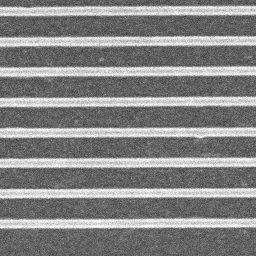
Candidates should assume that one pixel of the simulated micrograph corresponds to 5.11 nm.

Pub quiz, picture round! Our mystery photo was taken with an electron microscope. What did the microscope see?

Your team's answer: parallel lines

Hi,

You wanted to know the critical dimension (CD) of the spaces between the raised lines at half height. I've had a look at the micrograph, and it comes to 114 nanometers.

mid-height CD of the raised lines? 42.8 nm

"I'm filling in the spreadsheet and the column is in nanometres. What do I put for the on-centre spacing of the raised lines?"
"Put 155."